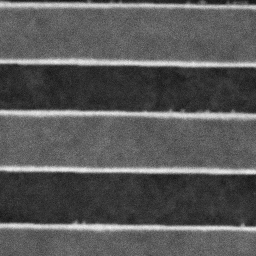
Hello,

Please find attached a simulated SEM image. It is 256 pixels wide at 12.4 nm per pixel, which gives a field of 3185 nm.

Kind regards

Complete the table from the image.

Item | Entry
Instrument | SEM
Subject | lines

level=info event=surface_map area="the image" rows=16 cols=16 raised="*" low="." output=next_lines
****************
****************
****************
****************
................
................
................
****************
****************
****************
****************
................
................
................
****************
****************